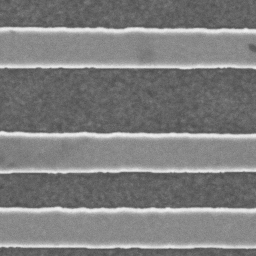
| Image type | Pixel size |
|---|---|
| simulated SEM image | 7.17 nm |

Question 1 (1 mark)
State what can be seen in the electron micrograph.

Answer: lines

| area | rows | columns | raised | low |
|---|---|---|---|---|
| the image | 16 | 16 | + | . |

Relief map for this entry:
................
................
++++++++++++++++
++++++++++++++++
................
................
................
................
++++++++++++++++
++++++++++++++++
++++++++++++++++
................
................
++++++++++++++++
++++++++++++++++
................